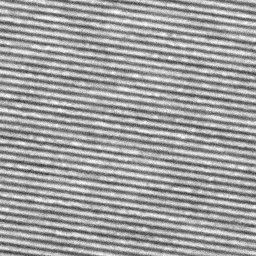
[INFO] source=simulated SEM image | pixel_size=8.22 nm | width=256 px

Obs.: parallel lines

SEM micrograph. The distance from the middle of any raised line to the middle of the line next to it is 62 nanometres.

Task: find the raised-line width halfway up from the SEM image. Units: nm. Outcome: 24.4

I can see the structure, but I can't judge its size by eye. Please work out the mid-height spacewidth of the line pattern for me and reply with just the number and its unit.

3.95 px